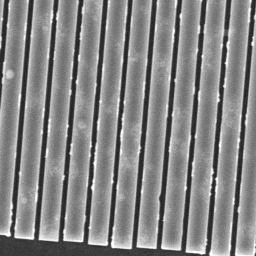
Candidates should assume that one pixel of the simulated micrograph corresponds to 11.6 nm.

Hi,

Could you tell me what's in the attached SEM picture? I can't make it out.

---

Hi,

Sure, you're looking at parallel lines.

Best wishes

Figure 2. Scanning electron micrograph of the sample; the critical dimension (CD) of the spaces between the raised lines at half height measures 0.0636 micrometres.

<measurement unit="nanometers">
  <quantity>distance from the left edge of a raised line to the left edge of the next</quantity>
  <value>284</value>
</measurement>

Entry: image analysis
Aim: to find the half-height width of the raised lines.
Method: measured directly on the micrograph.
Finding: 226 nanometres